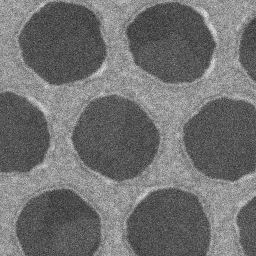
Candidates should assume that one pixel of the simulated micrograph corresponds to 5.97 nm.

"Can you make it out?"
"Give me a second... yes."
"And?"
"raised bodies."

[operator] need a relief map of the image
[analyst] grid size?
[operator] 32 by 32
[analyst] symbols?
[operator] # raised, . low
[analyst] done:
.....#####.........#####........
....########.#...########.....#.
...############.##########....##
...##########...##########....##
..###########...###########...##
..###########...###########...##
..###########...###########...##
...##########....##########...##
...##########....#########....##
.#...#######.......######......#
......###...........####........
##..............................
####.......######.........#####.
#####.....########.......#######
######....#########.....########
######...###########...#########
######...###########...#########
######...###########.#.#########
######...###########...#########
######....###########..#########
#####.....#########.##..########
####.......#######...#...#######
.............####..........###..
...#...##...........###.........
....######........#######.......
...########......########.....##
..##########....##########....##
..###########...##########...###
..###########...##########....##
..###########...###########...##
..###########...##########....##
...#########.#...#########....##